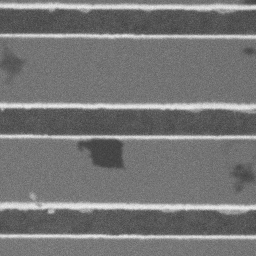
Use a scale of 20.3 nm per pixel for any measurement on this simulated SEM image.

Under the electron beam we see lines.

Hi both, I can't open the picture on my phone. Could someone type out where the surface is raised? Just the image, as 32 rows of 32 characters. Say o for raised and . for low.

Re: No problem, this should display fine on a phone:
oooooooooooooooooooooooooooooooo
................................
................................
................................
oooooooooooooooooooooooooo...o..
oooooooooooooooooooooooooooooooo
oooooooooooooooooooooooooooooooo
oooooooooooooooooooooooooooooooo
oooooooooooooooooooooooooooooooo
oooooooooooooooooooooooooooooooo
oooooooooooooooooooooooooooooooo
oooooooooooooooooooooooooooooooo
oooooooooooooooooooooooooooooooo
................................
................................
................................
................................
oooooooooooooooooooooooooooooooo
oooooooooooooooooooooooooooooooo
oooooooooooooooooooooooooooooooo
oooooooooooooooooooooooooooooooo
oooooooooooooooooooooooooooooooo
oooooooooooooooooooooooooooooooo
oooooooooooooooooooooooooooooooo
oooooooooooooooooooooooooooooooo
oooooooooooooooooooooooooooooooo
................................
................................
................................
ooo.............................
oooooooooooooooooooooooooooooooo
oooooooooooooooooooooooooooooooo